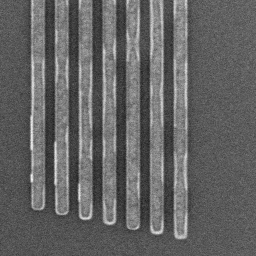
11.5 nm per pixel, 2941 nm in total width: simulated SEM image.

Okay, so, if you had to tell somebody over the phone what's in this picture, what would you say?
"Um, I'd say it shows groups of lines, slits or small figures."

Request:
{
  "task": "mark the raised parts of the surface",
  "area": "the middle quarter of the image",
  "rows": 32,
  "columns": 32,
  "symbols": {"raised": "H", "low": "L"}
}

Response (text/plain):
HLLLHHHLLLHHHLLLHHHLLLHHHLLLHHLL
HLLLHHHLLLHHHLLLHHHLLLHHHLLLHHLL
HLLLHHHLLLHHHLLLHHHLLLHHHLLLHHLL
HLLLHHHLLLHHHLLLHHHLLLHHHLLLHHLL
HLLLHHHLLLHHHLLLHHHLLLHHHLLLHHLL
HLLLHHHLLLHHLLLLHHHLLLHHLLLLHHLL
HLLLHHHLLLHHHLLLHHHLLLHHLLLLHHLL
HLLLHHLLLLHHHLLLHHHLLLHHLLLLHHLL
HLLLHHLLLLHHHLLLHHHLLLHHLLLLHHLL
HLLLHHLLLLHHHLLLHHHLLLHHLLLLHHLL
HLLLHHLLLLHHHLLLHHHLLLHHLLLLHHLL
HLLLHHLLLLHHHLLLHHHLLLHHLLLLHHLL
HLLLHHLLLLHHHLLLHHHLLLHHLLLLHHLL
HLLLHHLLLLHHHLLLHHHLLLHHLLLLHHLL
HLLLHHHLLLHHHLLLHHHLLLHHHLLLHHLL
HLLLHHHLLLHHHLLLHHHLLLHHHLLLHHLL
HLLLHHHLLLHHHLLLHHHLLLHHHLLLHHLL
HLLLHHHLLLHHHLLLHHHLLLHHHLLLHHLL
HLLLHHHLLLHHHLLLHHHLLLHHHLLLHHLL
HLLLHHHLLLHHHLLLHHHLLLHHHLLLHHLL
HLLLHHHLLLHHHLLLHHHLLLHHHLLLHHLL
HLLLHHHLLLHHHLLLHHHLLLHHHLLLHHLL
HLLLHHHLLLHHHLLLHHHLLLHHHLLLHHLL
HLLLHHHLLLHHHLLLHHHLLLHHHLLLHHLL
HLLLHHHLLLHHHLLLHHHLLLHHHLLLHHLL
HLLLHHHLLLHHHLLLHHHLLLHHHLLLHHLL
HLLLHHHLLLHHHLLLHHHLLLHHHLLLHHLL
HLLLHHHLLLHHHLLLHHHLLLHHHLLLHHLL
HLLLHHHLLLHHHLLLHHHLLLHHHLLLHHLL
HLLLHHHLLLHHHLLLHHHLLLHHHLLLHHLL
HLLLHHHLLLHHHLLLHHHLLLHHHLLLHHLL
HLLLHHHLLLHHHLLLHHHLLLHHHLLLHHLL